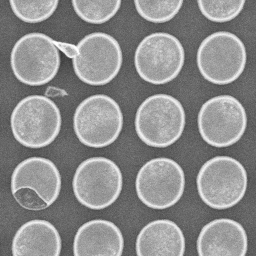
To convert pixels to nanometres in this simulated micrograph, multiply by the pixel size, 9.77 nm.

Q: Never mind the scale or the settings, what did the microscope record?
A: a regular array of raised bodies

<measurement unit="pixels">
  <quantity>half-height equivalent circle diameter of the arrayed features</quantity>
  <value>48.5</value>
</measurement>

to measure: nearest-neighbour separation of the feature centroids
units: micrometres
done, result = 0.601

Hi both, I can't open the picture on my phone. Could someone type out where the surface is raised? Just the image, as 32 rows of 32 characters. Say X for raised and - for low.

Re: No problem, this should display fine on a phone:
--XXXXX--XXXXXX--XXXXXX--XXXXX--
--XXXXX---XXXX---XXXXX---XXXXX--
---XX------XX------XX------X----
--------------------------------
----X------XX------XX------XX---
--XXXXXXX-XXXXX---XXXX---XXXXX--
--XXXXX-XXXXXXX--XXXXXX--XXXXXX-
-XXXXXX--XXXXXX--XXXXXX--XXXXXX-
--XXXXX--XXXXXX--XXXXX---XXXXX--
--XXXXX---XXXX----XXXX----XXXX--
----X------X--------------------
--------------------------------
---XXX-----XXX----XXXX----XXX---
--XXXXX---XXXXX---XXXXX--XXXXX--
--XXXXX--XXXXXX--XXXXXX--XXXXXX-
-XXXXXX--XXXXXX--XXXXXX--XXXXXX-
--XXXXX---XXXXX--XXXXXX--XXXXX--
--XXXX----XXXX----XXXX----XXX---
--------------------------------
--------------------------------
---XXXX---XXXX----XXXX----XXXX--
--XXXXX---XXXXX--XXXXXX--XXXXXX-
--XXXXX--XXXXXX--XXXXXX--XXXXXX-
--X-XXX--XXXXXX--XXXXXX--XXXXXX-
-----XX---XXXXX--XXXXX---XXXXX--
-----------XXX----XXX-----XXX---
--------------------------------
--------------------------------
---XXXX---XXXX----XXXX----XXXX--
--XXXXX---XXXXX--XXXXXX--XXXXXX-
--XXXXX--XXXXXX--XXXXXX--XXXXXX-
--XXXXX--XXXXXX--XXXXXX--XXXXXX-